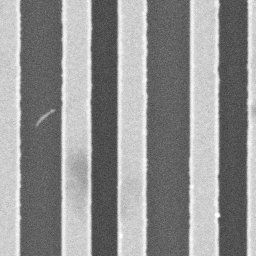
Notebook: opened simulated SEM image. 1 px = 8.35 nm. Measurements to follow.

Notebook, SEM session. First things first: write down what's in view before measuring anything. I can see lines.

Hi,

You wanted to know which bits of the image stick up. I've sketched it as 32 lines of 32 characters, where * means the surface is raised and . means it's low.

**......***....***......***....*
***.....***....***......***....*
***.....***....***......***....*
***.....***....***......***....*
**......***....***......***....*
***.....***....***......***....*
**......***....***......***....*
**......***....***......***....*
***.....***....***......***....*
***.....***....***......***....*
**......***....***......***....*
**......***....***......***....*
**......***....***......***....*
***.....***....***......***....*
***.....***....***......***....*
**......***....***......***....*
**......***....***......***....*
***.....***....***......***....*
**......***....***......***....*
***.....***....***......***....*
**......***....***......***....*
***.....***....***......***....*
**......***....***......***....*
***.....***....***......***....*
**......***....***......***....*
**......***....***......***....*
**......***....***......***....*
***.....***....***......***....*
**......***....***......***....*
**......***....***......***....*
**......***....***......***....*
**......***....***......***....*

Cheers